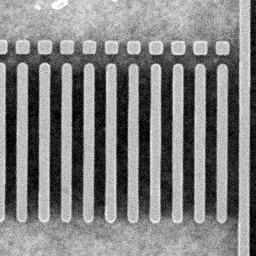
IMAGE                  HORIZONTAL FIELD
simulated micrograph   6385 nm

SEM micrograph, groups of lines, slits or small figures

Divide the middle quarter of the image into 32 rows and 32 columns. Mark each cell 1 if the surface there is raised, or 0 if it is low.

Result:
11000110000110000100001100001000
11000110000110001100001100011100
11000110000110001100001100011100
11000110000110001100001100011100
11000110000110001100001100011100
11000110000110001100001100011100
11000110000110001100001100011100
11000110000110001100001100011100
11000110000110001100001100011100
11000110000110001100001100011100
11000110000110001100001100011100
11000110000110001100001100011100
11000110000110001100001100011100
11000110000110001100001100011000
11000110000110001100001100011000
11000110000110001100001100011000
11000110000110001100001100011000
11000110000110001100001100011000
11000110000110001100001100011000
11000110000110001100001100011000
11000110000110001100001100011000
11000110000110001100001100011000
11000110000110001100001100011000
11000110000110001100001100011000
11000110000110001100001100011000
11000110000110001100001100011000
11000110000110001100001100011000
11000110000110001100001100011000
11000110000110001100001100011000
11000110000110001100001100011000
11000110000110001100001100011000
11000110000110001100001100011000